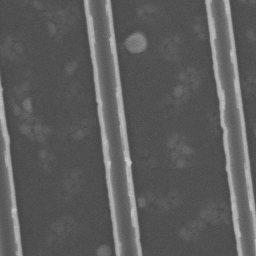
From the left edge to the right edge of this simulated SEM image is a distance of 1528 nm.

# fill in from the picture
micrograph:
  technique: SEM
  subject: one or a few lines or trenches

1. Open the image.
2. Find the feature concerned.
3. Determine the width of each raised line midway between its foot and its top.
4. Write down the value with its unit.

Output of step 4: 132 nm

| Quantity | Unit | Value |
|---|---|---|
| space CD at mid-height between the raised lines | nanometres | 583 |